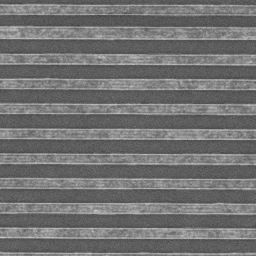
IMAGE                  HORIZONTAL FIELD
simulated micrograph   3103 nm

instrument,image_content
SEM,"parallel lines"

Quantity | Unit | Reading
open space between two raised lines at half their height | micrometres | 0.185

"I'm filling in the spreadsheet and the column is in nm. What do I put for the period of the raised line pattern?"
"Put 301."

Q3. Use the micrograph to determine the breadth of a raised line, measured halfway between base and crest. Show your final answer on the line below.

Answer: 114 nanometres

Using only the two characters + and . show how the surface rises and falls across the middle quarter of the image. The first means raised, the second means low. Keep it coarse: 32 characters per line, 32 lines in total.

................................
................................
................................
................................
++++++++++++++++++++++++++++++++
++++++++++++++++++++++++++++++++
................................
................................
................................
................................
++++++++++++++++++++++++++++++++
++++++++++++++++++++++++++++++++
................................
................................
................................
................................
+++++++++++++++.................
++++++++++++++++++++++++++++++++
++++++++++++++++++++++++++++++++
................................
................................
................................
................................
++++++++++++++++++++++++++++++++
++++++++++++++++++++++++++++++++
................................
................................
................................
................................
++++++++++++++++++++++++++++++++
++++++++++++++++++++++++++++++++
................................